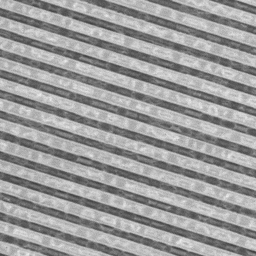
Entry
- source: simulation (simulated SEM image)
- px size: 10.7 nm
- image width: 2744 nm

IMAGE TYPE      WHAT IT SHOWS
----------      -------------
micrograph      parallel lines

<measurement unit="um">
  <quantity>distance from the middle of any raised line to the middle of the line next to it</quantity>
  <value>0.209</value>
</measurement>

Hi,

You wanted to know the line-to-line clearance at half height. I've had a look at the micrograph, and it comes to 8.7 px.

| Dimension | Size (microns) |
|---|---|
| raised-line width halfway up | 0.114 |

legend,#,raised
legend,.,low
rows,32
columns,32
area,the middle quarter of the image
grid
#######........########........#
.#########........########......
....#########........########...
........########........########
####.......#########.......#####
#######.......#########.......##
.#########.......#########......
....#########.......#########...
........########........########
###........#########.......#####
######........#########.......##
#########........#########......
...#########........#########...
.......########........#########
##.........########........#####
######........########........##
#########........########.......
...#########........########....
......#########........########.
##........########.........#####
######.......#########........##
#########.......#########.......
...#########.......#########....
......#########.......#########.
##........########........######
#####........#########.......###
#########.......#########.......
...#########.......#########....
......#########.......#########.
##.......#########.......#######
#####........########........###
########........#########.......